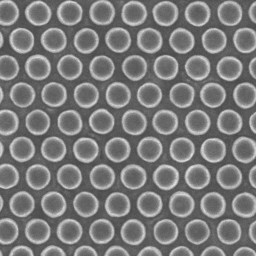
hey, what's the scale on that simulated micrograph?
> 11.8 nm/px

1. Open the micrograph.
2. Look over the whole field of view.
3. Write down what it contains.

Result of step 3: a regular array of raised bodies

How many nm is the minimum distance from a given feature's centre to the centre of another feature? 365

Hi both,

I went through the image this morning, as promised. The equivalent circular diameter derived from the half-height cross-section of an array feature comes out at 282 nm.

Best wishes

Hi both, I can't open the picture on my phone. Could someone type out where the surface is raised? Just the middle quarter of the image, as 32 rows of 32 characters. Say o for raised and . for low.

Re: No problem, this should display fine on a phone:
oooo...oooooo..ooooo...ooooo..oo
oooo...oooooo..ooooo...ooooo..oo
oooo...ooooo...ooooo...ooooo...o
ooo.....ooo.....ooo.....ooo.....
................................
....ooo....oooo....oooo.....ooo.
...ooooo...ooooo...ooooo...ooooo
...ooooo...ooooo...ooooo...ooooo
...ooooo...ooooo...ooooo...ooooo
...ooooo...ooooo...ooooo...ooooo
....ooo......oo.....oo.......oo.
................................
ooo....oooo....oooo....oooo....o
oooo..oooooo...ooooo..oooooo...o
oooo..oooooo...ooooo..oooooo...o
oooo...ooooo...ooooo...ooooo...o
oooo...ooooo...ooooo...ooooo...o
..o..............oo......o......
.............o..................
...ooooo...ooooo...ooooo...ooooo
...ooooo...ooooo...ooooo...ooooo
...ooooo...ooooo...ooooo...ooooo
...ooooo...ooooo...ooooo...ooooo
...ooooo...oooo....oooo....ooooo
................................
.oo......o......................
oooo...ooooo...ooooo...ooooo...o
oooo...ooooo..oooooo...ooooo...o
oooo...ooooo..oooooo...ooooo...o
oooo...ooooo...ooooo...ooooo...o
ooo.....ooo.....ooo.....ooo.....
................................